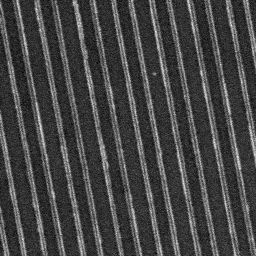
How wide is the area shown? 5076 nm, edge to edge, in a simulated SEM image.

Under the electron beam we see parallel lines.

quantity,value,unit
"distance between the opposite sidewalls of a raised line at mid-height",75.6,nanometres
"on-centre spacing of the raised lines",373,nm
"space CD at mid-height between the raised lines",0.288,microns